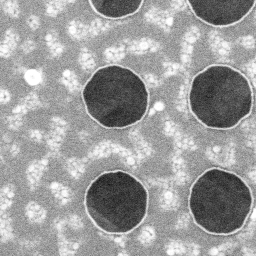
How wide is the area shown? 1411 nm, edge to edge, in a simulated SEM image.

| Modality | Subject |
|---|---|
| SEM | raised bodies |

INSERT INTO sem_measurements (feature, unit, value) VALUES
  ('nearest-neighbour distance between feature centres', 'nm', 573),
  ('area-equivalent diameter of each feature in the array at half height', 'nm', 357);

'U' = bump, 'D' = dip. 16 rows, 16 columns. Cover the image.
DDDDDDUUUDDDUUUU
DDDDDDDDDDDDDUUD
DDDDDDDDDDDDDDDD
DDDDDDDDDDDDDDDD
DDDDDDUUDDDDDUUD
DDDDDUUUUDDDUUUU
DDDDDUUUUDDDUUUU
DDDDDDUUUDDDUUUD
DDDDDDDDDDDDDDDD
DDDDDDDDDDDDDDDD
DDDDDDDDDDDDDDDD
DDDDDDUUUDDDUUUD
DDDDDUUUUDDDUUUU
DDDDDDUUUDDDUUUU
DDDDDDDUDDDDDUUD
DDDDDDDDDDDDDDDD